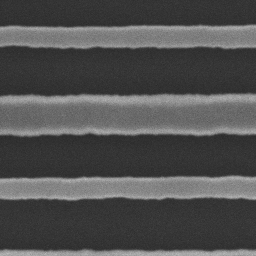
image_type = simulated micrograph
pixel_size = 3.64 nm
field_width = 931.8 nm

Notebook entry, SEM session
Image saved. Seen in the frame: lines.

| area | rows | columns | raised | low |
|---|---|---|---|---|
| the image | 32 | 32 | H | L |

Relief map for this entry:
LLLLLLLLLLLLLLLLLLLLLLLLLLLLLLLL
LLLLLLLLLLLLLLLLLLLLLLLLLLLLLLLL
LLLLLLLLLLLLLLLLLLLLLLLLLLLLLLLL
HHHHHHHHLHHHHHHHHHHHHHHHHHHHHHHH
HHHHHHHHHHHHHHHHHHHHHHHHHHHHHHHH
HHHHHHHHHHHHHHHHHHHHHHHHHHHHHHHH
LLLLLLLLLLLLLLLLLLLLLLLLLLLLLLLL
LLLLLLLLLLLLLLLLLLLLLLLLLLLLLLLL
LLLLLLLLLLLLLLLLLLLLLLLLLLLLLLLL
LLLLLLLLLLLLLLLLLLLLLLLLLLLLLLLL
LLLLLLLLLLLLLLLLLLLLLLLLLLLLLLLL
LLLLLLLLLLLLLLLLLLLLLLLLLLLLLLLL
HHHHHHHHHHHHHHHHHHHHHHHHHHHHHHHH
HHHHHHHHHHHHHHHHHHHHHHHHHHHHHHHH
HHHHHHHHHHHHHHHHHHHHHHHHHHHHHHHH
HHHHHHHHHHHHHHHHHHHHHHHHHHHHHHHH
HHHHHHHHHHHHHHHHHHHHHHHHHHHHHHHH
LLLLLLLLLLLLLLLLLLLLLLLLLLLLLLLL
LLLLLLLLLLLLLLLLLLLLLLLLLLLLLLLL
LLLLLLLLLLLLLLLLLLLLLLLLLLLLLLLL
LLLLLLLLLLLLLLLLLLLLLLLLLLLLLLLL
LLLLLLLLLLLLLLLLLLLLLLLLLLLLLLLL
HHHHHHHHHHHHHHHHHHHHHHHHHHHHHHHH
HHHHHHHHHHHHHHHHHHHHHHHHHHHHHHHH
HHHHHHHHHHHHHHHHHHHHHHHHHHHHHHHH
LLLLLLLLLLLLLLLLLLLLLLLLLLLLLLLL
LLLLLLLLLLLLLLLLLLLLLLLLLLLLLLLL
LLLLLLLLLLLLLLLLLLLLLLLLLLLLLLLL
LLLLLLLLLLLLLLLLLLLLLLLLLLLLLLLL
LLLLLLLLLLLLLLLLLLLLLLLLLLLLLLLL
LLLLLLLLLLLLLLLLLLLLLLLLLLLLLLLL
HHLLLLLLLLLLLLLLLLLLLLLLLLLHLHHH